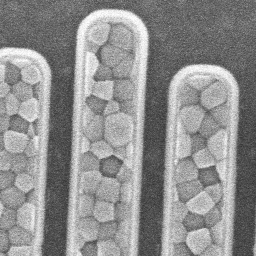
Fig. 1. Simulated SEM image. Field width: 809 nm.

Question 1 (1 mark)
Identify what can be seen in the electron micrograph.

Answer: one or a few lines or trenches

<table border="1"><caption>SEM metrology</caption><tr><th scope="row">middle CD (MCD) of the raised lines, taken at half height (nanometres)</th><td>206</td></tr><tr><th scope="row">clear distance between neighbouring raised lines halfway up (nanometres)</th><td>91.1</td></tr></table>